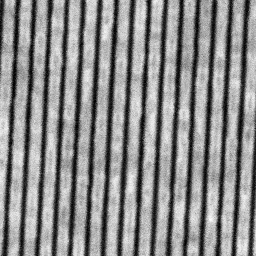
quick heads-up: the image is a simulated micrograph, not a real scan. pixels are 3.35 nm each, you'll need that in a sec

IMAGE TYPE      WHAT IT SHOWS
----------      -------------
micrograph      parallel lines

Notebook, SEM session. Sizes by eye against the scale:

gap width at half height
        17.1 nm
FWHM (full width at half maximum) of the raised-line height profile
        36.8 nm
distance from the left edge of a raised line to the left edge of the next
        54.7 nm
